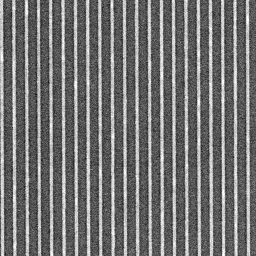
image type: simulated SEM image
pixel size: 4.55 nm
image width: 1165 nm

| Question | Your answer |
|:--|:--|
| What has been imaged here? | parallel lines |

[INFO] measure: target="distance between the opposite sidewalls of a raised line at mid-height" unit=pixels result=2.75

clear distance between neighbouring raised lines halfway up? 42.7 nm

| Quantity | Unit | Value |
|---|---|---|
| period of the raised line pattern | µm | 0.0559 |